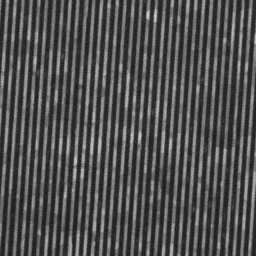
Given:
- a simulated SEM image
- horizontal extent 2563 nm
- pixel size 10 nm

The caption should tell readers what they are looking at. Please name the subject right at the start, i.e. parallel lines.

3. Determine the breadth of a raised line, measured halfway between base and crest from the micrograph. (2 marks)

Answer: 21.2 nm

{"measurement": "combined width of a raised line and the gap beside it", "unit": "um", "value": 0.0784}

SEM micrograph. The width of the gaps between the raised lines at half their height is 54.9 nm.